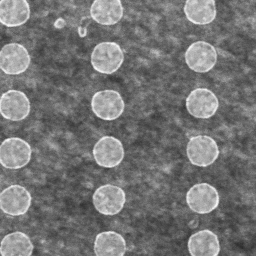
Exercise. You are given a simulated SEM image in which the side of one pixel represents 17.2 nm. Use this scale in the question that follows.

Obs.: a regular array of raised bodies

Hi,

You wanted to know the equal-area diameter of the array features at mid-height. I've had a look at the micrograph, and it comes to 523 nm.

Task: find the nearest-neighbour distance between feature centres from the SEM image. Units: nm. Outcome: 809